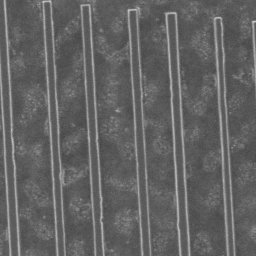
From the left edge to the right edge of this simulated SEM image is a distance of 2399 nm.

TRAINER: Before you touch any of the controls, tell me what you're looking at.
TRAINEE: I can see parallel lines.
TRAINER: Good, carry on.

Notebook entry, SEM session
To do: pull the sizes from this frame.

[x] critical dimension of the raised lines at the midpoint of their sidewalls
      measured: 78.3 nm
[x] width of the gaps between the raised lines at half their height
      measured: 350 nm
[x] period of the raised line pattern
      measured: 401 nm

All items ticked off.